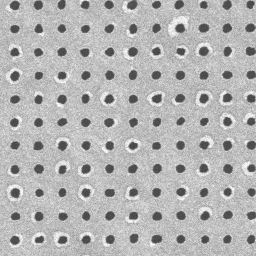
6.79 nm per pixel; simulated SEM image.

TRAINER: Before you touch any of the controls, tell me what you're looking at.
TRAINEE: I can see a regular array of holes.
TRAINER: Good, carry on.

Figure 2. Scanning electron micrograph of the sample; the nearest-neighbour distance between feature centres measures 157 nanometers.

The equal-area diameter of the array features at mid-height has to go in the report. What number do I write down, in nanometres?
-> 62.7